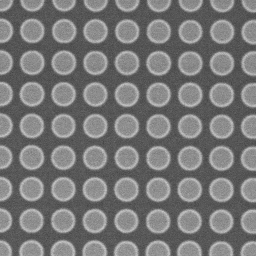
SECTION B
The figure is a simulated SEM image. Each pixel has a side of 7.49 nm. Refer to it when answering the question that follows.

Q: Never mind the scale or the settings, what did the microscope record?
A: an array of small figures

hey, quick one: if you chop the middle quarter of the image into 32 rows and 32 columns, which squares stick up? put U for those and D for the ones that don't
UUUDDUUUUUUDDUUUUUUDDUUUUUUDDUUU
UUDDDDUUUUDDDUUUUUDDDUUUUUDDDUUU
UDDDDDDUUDDDDDDUUDDDDDDUUDDDDDUU
DDDDDDDDDDDDDDDDDDDDDDDDDDDDDDDD
DDDDDDDDDDDDDDDDDDDDDDDDDDDDDDDD
UUDDDDUUUUDDDDUUUUDDDDUUUDDDDDUU
UUUDDUUUUUDDDUUUUUDDDUUUUUDDDUUU
UUUDDUUUUUUDDUUUUUDDDUUUUUUDDUUU
UUUDDUUUUUUDDUUUUUDDDUUUUUDDDUUU
UUDDDDUUUUDDDUUUUUDDDUUUUUDDDUUU
DDDDDDDDDDDDDDDDDDDDDDDUUDDDDDDU
DDDDDDDDDDDDDDDDDDDDDDDDDDDDDDDD
DDDDDDDDDDDDDDDDDDDDDDDDDDDDDDDD
UUDDDDUUUUDDDDUUUUDDDDUUUUDDDDUU
UUUDDUUUUUUDDUUUUUDDDUUUUUDDDUUU
UUUDDUUUUUUDDUUUUUDDDUUUUUUDDUUU
UUUDDUUUUUUDDUUUUUDDDUUUUUDDDUUU
UUDDDDUUUUDDDUUUUUDDDUUUUUDDDUUU
DDDDDDDDDDDDDDDDDDDDDDDDDDDDDDDD
DDDDDDDDDDDDDDDDDDDDDDDDDDDDDDDD
DDDDDDDDDDDDDDDDDDDDDDDDDDDDDDDD
UUDDDDUUUUDDDDUUUUDDDDUUUUDDDUUU
UUUDDUUUUUDDDUUUUUDDDUUUUUDDDUUU
UUUDDUUUUUUDDUUUUUDDDUUUUUDDDUUU
UUUDDUUUUUDDDUUUUUDDDUUUUUDDDUUU
UUDDDDUUUUDDDDUUUUDDDUUUUUDDDUUU
DDDDDDDDDDDDDDDDDDDDDDDDDDDDDDDD
DDDDDDDDDDDDDDDDDDDDDDDDDDDDDDDD
DDDDDDDDDDDDDDDDDDDDDDDDDDDDDDDD
UUDDDUUUUUDDDUUUUUDDDUUUUUDDDUUU
UUUDDUUUUUUDDUUUUUDDDUUUUUDDDUUU
UUUDDUUUUUUDDUUUUUDDDUUUUUDDDUUU